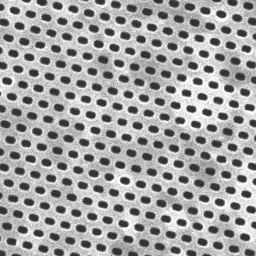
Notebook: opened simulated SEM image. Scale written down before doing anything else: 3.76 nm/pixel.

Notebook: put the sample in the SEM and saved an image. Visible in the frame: a regular array of holes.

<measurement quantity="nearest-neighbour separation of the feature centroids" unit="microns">0.06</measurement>